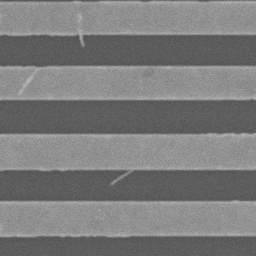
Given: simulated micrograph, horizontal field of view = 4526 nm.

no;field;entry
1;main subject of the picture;lines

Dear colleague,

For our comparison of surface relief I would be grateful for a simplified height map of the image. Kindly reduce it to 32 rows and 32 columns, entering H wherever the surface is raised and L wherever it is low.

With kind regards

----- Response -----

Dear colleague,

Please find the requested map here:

HHHHHHHHHHHHHHHHHHHHHHHHHHHHHHHH
HHHHHHHHHHHHHHHHHHHHHHHHHHHHHHHH
HHHHHHHHHHHHHHHHHHHHHHHHHHHHHHHH
HHHHHHHHHHHHHHHHHHHHHHHHHHHHHHHH
LLLLLLLLLLHLLLLLLLLLLLLLLLLLLLLL
LLLLLLLLLLLLLLLLLLLLLLLLLLLLLLLL
LLLLLLLLLLLLLLLLLLLLLLLLLLLLLLLL
LLLLLLLLLLLLLLLLLLLLLLLLLLLLLLLL
HHHHHHHHHHHHHHHHHHHHHHHHHHHHHHHH
HHHHHHHHHHHHHHHHHHHHHHHHHHHHHHHH
HHHHHHHHHHHHHHHHHHHHHHHHHHHHHHHH
HHHHHHHHHHHHHHHHHHHHHHHHHHHHHHHH
LLLLLLLLLLLLLLLLLLLLLLLLLLLLLLLL
LLLLLLLLLLLLLLLLLLLLLLLLLLLLLLLL
LLLLLLLLLLLLLLLLLLLLLLLLLLLLLLLL
LLLLLLLLLLLLLLLLLLLLLLLLLLLLLLLL
LLLLLLLLLLLLLLLLLLLLLLLLLLLLLLLL
HHHHHHHHHHHHHHHHHHHHHHHHHHHHHHHH
HHHHHHHHHHHHHHHHHHHHHHHHHHHHHHHH
HHHHHHHHHHHHHHHHHHHHHHHHHHHHHHHH
HHHHHHHHHHHHHHHHHHHHHHHHHHHHHHHH
LLLLLLLLLLLLLLLLLLLLLLLLLLLLLLLL
LLLLLLLLLLLLLLLLLLLLLLLLLLLLLLLL
LLLLLLLLLLLLLLLLLLLLLLLLLLLLLLLL
LLLLLLLLLLLLLLLLLLLLLLLLLLLLLLLL
HHHHHHHHHHHHHHHHHHHHHHHHHHHHHHHH
HHHHHHHHHHHHHHHHHHHHHHHHHHHHHHHH
HHHHHHHHHHHHHHHHHHHHHHHHHHHHHHHH
HHHHHHHHHHHHHHHHHHHHHHHHHHHHHHHH
LLLHLLLLLHLLLLLLLLLLLLLLLLLLLLLL
LLLLLLLLLLLLLLLLLLLLLLLLLLLLLLLL
LLLLLLLLLLLLLLLLLLLLLLLLLLLLLLLL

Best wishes